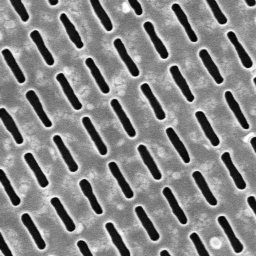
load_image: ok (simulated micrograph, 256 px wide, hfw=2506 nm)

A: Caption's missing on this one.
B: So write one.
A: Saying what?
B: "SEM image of a regular array of holes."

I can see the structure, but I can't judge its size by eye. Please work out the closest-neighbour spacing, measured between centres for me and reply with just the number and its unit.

33.5 px